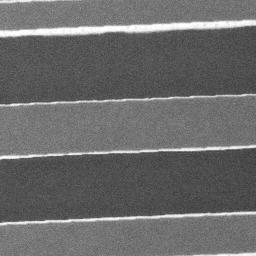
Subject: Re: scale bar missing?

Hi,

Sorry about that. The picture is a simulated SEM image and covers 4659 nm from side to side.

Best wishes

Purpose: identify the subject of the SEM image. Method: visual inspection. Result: lines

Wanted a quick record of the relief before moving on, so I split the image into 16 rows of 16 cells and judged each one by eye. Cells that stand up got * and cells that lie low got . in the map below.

****************
*************...
................
................
................
................
..**************
****************
****************
********........
................
................
................
...........*****
****************
****************